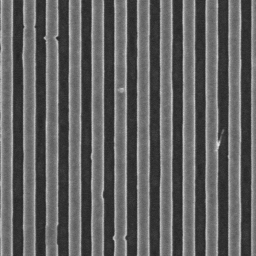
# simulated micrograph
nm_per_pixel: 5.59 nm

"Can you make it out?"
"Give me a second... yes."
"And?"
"parallel lines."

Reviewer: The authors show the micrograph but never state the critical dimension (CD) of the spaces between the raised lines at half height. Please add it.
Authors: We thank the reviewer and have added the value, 0.0643 µm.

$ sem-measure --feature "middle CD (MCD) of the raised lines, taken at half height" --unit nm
64.3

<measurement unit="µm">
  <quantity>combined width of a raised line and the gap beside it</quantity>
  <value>0.128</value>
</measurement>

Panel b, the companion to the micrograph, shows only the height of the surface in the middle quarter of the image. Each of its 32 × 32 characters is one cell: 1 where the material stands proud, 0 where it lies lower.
01110001110001100011100011100011
01110001110001100011100011100011
01110001110001100011100011100011
01110001110001100011100011100011
01110001110001100011100011100011
01110001110001100011100011100011
01110001110001100011100011100011
01110001110001110011100011100011
01110001110001110011100011100011
01110001110001100011100011100011
01110001110001100011100011100011
01110001110001100011100011100011
01110001110001100011100011100011
01110001110001100011100011100011
01110001110001100011100011100011
01110001110001100011100011100011
01110001110001100011100011100011
01110001110001100011100011100011
01110001110001100011100011100011
01110001110001100011100011100011
01110001110001100011100011100011
01110001110001100011100011100011
01110001110001100011100011100011
01110001110001100011100011100011
01110001110001100011100011100011
01110001110001100011100011100011
01110001110001100011100011100011
01110001110001100011100011100011
01110001110001100011100011100011
01110001110001100011100011100011
01110001110001100011100011100011
01110001110001100011100011100011